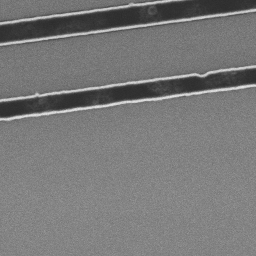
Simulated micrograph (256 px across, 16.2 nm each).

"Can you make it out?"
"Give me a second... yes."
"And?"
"one or a few lines or trenches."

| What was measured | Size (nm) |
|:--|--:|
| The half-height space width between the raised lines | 900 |